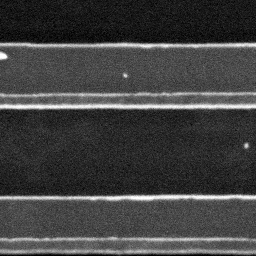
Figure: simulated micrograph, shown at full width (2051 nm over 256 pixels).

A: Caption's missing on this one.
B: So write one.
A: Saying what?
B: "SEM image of lines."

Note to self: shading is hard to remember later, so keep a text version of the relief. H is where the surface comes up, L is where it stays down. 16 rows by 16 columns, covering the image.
LLLLLLLLLLLLLLLL
LLLLLLLLLLLLLLLL
LLLLLLLLLLLLLLLL
HHHHHHHHHHHHHHHH
HHHHHHHHHHHHHHHH
HHHHHHHHHHHHHHHH
HHHHHHHHHHHHHHHH
LLLLLLLLLLLLLLLL
LLLLLLLLLLLLLLLL
LLLLLLLLLLLLLLLL
LLLLLLLLLLLLLLLL
LLLLLLLLLLLLLLLL
HHHHHHHHHHHHHHHH
HHHHHHHHHHHHHHHH
HHHHHHHHHHHHHHHH
HHHHHHHHHHHHHHHH